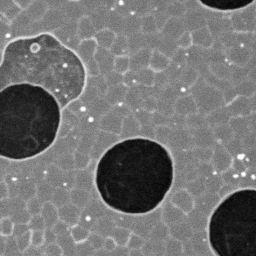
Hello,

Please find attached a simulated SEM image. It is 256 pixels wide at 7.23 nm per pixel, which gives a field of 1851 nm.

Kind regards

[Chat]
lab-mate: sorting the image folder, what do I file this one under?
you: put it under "holes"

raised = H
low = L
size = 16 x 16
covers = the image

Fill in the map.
HHHHHHHHHHHHHLLH
HHHHHHHHHHHHHHHH
HHHHHHHHHHHHHHHH
HHHHHHHHHHHHHHHH
HHHHHHHHHHHHHHHH
LLLHHHHHHHHHHHHH
LLLLHHHHHHHHHHHH
LLLLHHHHHHHHHHHH
LLLHHHHHHHHHHHHH
LLLHHHHLLLHHHHHH
HHHHHHLLLLLHHHHH
HHHHHHLLLLLHHHHH
HHHHHHHLLLHHHHLL
HHHHHHHHHHHHHLLL
HHHHHHHHHHHHHLLL
HHHHHHHHHHHHHLLL